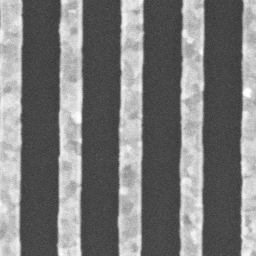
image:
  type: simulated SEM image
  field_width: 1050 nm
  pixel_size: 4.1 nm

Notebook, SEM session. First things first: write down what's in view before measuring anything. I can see lines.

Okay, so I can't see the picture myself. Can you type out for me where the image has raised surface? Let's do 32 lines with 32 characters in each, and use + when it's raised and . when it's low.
+++.....++.....+++.....++......+
+++.....++.....+++.....++.....++
+++.....++.....+++.....++.....++
+++.....++.....+++.....++.....++
+++.....++.....+++.....++.....++
+++.....++.....+++.....++.....++
+++.....++.....+++.....++.....++
+++.....++.....+++.....++.....++
+++.....++.....+++.....++.....++
+++.....++.....+++.....++.....++
+++.....++.....+++.....++.....++
++......++.....+++.....++......+
++......++.....+++.....++.....++
++......++.....+++.....++.....++
++.....+++.....+++.....++.....++
++.....+++.....+++.....++.....++
++......++.....+++.....++.....++
+++.....++.....+++.....++.....++
+++.....++.....+++.....++.....++
++.....+++.....+++.....++.....++
++.....+++.....+++.....++.....++
++.....+++.....+++.....++.....++
++.....+++.....+++.....++.....++
++.....+++.....+++.....++.....++
++.....+++.....+++.....++.....++
++.....+++.....+++.....++.....++
++.....+++.....++......++.....++
++.....+++.....++......++.....++
++.....+++.....+++.....++.....++
++.....+++.....+++.....++.....++
++.....+++.....++......++.....++
++.....+++.....++......++.....++